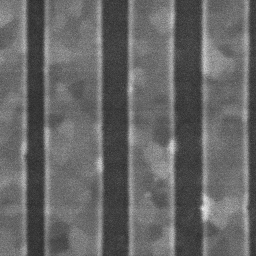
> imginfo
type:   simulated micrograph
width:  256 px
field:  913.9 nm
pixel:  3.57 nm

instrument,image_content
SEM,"one or a few lines or trenches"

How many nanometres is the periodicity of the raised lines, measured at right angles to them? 271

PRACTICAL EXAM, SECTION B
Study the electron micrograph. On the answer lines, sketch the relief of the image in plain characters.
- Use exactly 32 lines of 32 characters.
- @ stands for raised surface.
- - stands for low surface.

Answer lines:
@@@---@@@@@@@---@@@@@@---@@@@@@-
@@@---@@@@@@@---@@@@@@---@@@@@@-
@@@---@@@@@@@---@@@@@@---@@@@@@-
@@@---@@@@@@@---@@@@@@---@@@@@@-
@@@---@@@@@@@---@@@@@@---@@@@@@-
@@@---@@@@@@@---@@@@@@---@@@@@@-
@@@---@@@@@@@---@@@@@@---@@@@@@-
@@@---@@@@@@@---@@@@@----@@@@@@-
@@@---@@@@@@@---@@@@@----@@@@@@-
@@@---@@@@@@@---@@@@@@---@@@@@@-
@@@---@@@@@@@---@@@@@@---@@@@@@-
@@@---@@@@@@@---@@@@@@---@@@@@@-
@@@---@@@@@@@---@@@@@@---@@@@@@-
@@@---@@@@@@@---@@@@@@---@@@@@@-
@@@---@@@@@@@---@@@@@@---@@@@@@-
@@@---@@@@@@@---@@@@@@---@@@@@@-
@@@---@@@@@@@---@@@@@@---@@@@@@-
@@@---@@@@@@@---@@@@@@---@@@@@@-
@@@---@@@@@@@---@@@@@@---@@@@@@-
@@@---@@@@@@@---@@@@@@---@@@@@@-
@@@---@@@@@@@---@@@@@@---@@@@@@-
@@@---@@@@@@@---@@@@@@---@@@@@@-
@@@---@@@@@@@---@@@@@@---@@@@@@-
@@@---@@@@@@@---@@@@@@---@@@@@@-
@@@---@@@@@@@---@@@@@@---@@@@@@-
@@@---@@@@@@@---@@@@@@---@@@@@@-
@@@---@@@@@@@---@@@@@@---@@@@@@-
@@@---@@@@@@@---@@@@@@---@@@@@@-
@@@---@@@@@@@---@@@@@@---@@@@@@-
@@@---@@@@@@@---@@@@@@---@@@@@@-
@@@---@@@@@@@---@@@@@@---@@@@@@-
@@@---@@@@@@@---@@@@@@---@@@@@@-